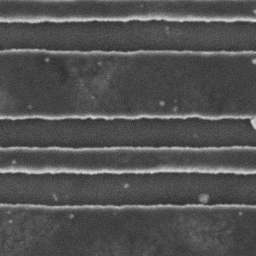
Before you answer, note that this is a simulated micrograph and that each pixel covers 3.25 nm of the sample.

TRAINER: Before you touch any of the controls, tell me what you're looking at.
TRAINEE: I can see lines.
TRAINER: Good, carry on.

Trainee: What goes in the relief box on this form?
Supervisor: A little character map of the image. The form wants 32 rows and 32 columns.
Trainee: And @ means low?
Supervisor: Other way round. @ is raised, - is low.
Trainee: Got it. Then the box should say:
@@@@@@@@@@@@@@@@@@@@@@@@@@@@@@@@
@@@@@@@@@@@@@@@@@@@@@@@@@@@@@@@@
@@@@@@@@@@@-@--@------@--@@-@@@@
--------------------------------
--------------------------------
--------------------------------
@@@@@@@@@@-@@-@--@@@@@@@---@--@@
@@@@@@@@@@@@@@@@@@@@@@@@@@@@@@@@
@@@@@@@@@@@@@@@@@@@@@@@@@@@@@@@@
@@@@@@@@@@@@@@@@@@@@@@@@@@@@@@@@
@@@@@@@@@@@@@@@@@@@@@@@@@@@@@@@@
@@@@@@@@@@@@@@@@@@@@@@@@@@@@@@@@
@@@@@@@@@@@@@@@@@@@@@@@@@@@@@@@@
@@@@@@@@@@@@@@@@@@@@@@@@@@@@@@@@
@@@@@@@@@@@@@@@@@@@@@@@@@@@@@@@@
--------------------------------
--------------------------------
--------------------------------
@@@@@-@@-----@@@@@@@@@@@-@@@@@@@
@@@@@@@@@@@@@@@@@@@@@@@@@@@@@@@@
@@@@@@@@@@@@@@@@@@@@@@@@@@@@@@@@
---@@@@--@@@@@@@@@@----------@@@
--------------------------------
--------------------------------
--------------------------------
--------------------------------
@@@@@@@@@@@@@@@@@@@@@@@@@@@@@@@@
@@@@@@@@@@@@@@@@@@@@@@@@@@@@@@@@
@@@@@@@@@@@@@@@@@@@@@@@@@@@@@@@@
@@@@@@@@@@@@@@@@@@@@@@@@@@@@@@@@
@@@@@@@@@@@@@@@@@@@@@@@@@@@@@@@@
@@@@@@@@@@@@@@@@@@@@@@@@@@@@@@@@